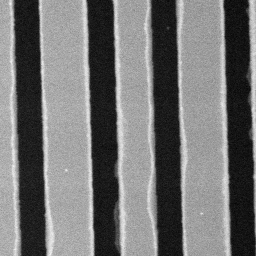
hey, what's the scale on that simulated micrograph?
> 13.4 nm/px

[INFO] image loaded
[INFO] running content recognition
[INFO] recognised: lines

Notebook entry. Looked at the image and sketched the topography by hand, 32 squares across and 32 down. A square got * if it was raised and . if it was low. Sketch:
**...******...*****...******...*
**...******...*****...******...*
**...******...*****...******...*
**...******...*****...******...*
**...******...*****...******...*
**...******...*****...******...*
**...******...*****...******...*
**...******...*****...******...*
**...******...*****...******...*
**...******....****...******...*
**...******....****...******...*
**...******....****...******...*
**...******....****...******...*
**...******....****....*****...*
**...******....****....*****....
**...******....****....*****....
**...******....****....*****....
**....*****....****....*****....
**....*****....****....*****....
**....*****....****....*****....
**....*****....****....*****....
**....*****....****....*****....
**....*****....****....*****....
**....******...****....******...
**....*****....****....******...
**....******...****....******...
**....******...****....******...
**....******...****....******...
**....******...****....******...
**....******...*****...******...
**....******...*****...******...
**....******...*****...******...